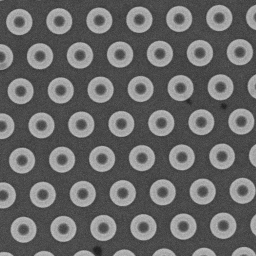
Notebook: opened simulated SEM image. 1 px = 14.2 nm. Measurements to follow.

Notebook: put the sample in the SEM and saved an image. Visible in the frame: an array of small figures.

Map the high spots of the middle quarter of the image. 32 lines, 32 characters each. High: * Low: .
..****.......***.......**.......
................................
................................
........**........***......****.
**.....*****.....*****....******
**....******....******....******
**....******....******....******
**....******....******....******
**.....*****.....****......****.
*........*......................
................................
................................
...***......****......*****.....
..*****.....*****....******....*
.******....******....******....*
.******....******....******....*
.******....******.....*****.....
..*****.....****.......***......
................................
................................
...................**.......***.
**.....*****.....*****.....*****
**.....*****....*******...******
***...*******...*******...******
***...*******...*******....*****
**.....*****.....*****.....*****
*.......***.......***...........
................................
................................
....**.......***.......****.....
..*****.....*****.....*****.....
..******....******....******...*